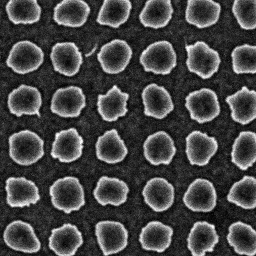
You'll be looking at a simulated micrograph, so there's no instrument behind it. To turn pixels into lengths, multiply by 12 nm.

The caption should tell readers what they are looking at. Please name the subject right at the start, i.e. a regular array of raised bodies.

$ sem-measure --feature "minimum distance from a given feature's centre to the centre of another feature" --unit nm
516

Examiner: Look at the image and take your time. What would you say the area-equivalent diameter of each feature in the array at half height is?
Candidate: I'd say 31.4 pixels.